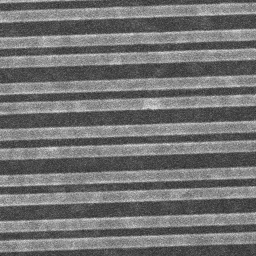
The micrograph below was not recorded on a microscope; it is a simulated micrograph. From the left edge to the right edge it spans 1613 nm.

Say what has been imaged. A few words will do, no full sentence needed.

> parallel lines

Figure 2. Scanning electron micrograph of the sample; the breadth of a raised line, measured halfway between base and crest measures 68.4 nm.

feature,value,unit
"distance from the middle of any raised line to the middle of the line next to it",0.145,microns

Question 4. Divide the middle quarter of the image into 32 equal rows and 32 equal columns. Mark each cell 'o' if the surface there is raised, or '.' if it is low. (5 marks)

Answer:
................................
................................
................................
..............................oo
oooooooooooooooooooooooooooooooo
oooooooooooooooooooooooooooooooo
oooooooooooooo..................
................................
.........................o.ooooo
oooooooooooooooooooooooooooooooo
oooooooooooooooooooooooooooooooo
oooooooooo......................
................................
................................
................................
...............ooooooooooooooooo
oooooooooooooooooooooooooooooooo
ooooooooooooooooooooooooooooooo.
................................
................................
............oooooooooooooooooooo
oooooooooooooooooooooooooooooooo
ooooooooooooooooooooooooooo.....
................................
................................
................................
............................oooo
..oooooooooooooooooooooooooooooo
oooooooooooooooooooooooooooooooo
ooooooooooooo...................
................................
........................oooooooo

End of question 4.